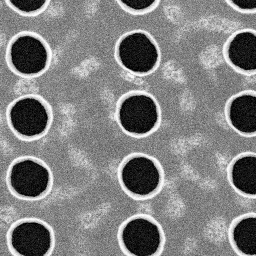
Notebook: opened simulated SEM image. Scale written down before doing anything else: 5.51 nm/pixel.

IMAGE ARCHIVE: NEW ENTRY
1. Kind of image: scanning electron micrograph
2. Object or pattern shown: holes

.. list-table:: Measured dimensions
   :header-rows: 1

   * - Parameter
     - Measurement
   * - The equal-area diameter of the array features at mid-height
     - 227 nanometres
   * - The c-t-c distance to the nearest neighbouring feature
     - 61.5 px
